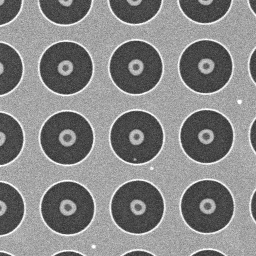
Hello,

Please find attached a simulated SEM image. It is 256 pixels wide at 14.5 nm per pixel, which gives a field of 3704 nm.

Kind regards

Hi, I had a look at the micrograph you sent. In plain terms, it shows an array of small figures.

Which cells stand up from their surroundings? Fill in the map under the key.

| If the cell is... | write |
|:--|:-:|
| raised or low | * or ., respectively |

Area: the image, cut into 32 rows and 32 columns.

...**......***......**.......**.
..***......***......***.....****
..****....*****....*****...*****
********************************
********************************
.******...*****....*****....****
..****.....***......***......***
...**......***......**.......**.
...**...*...**...*..**...*...**.
...**......***......***......**.
..****.....***......***.....****
.******...******..******...*****
********************************
********************************
.*****....*****....*****....****
..****.....***......***......***
...**.......**......***......**.
...**...*...**......***..*...**.
...**......***......***......***
..****.....****....*****....****
.******..***********************
********************************
********************************
..****.....****.....***.....****
...**......***......***......***
...**...*...**...*..***..*...**.
...**.......**......***......**.
...**.......**......***......***
..****.....****....*****....****
********************************
********************************
*******...******..*******..*****